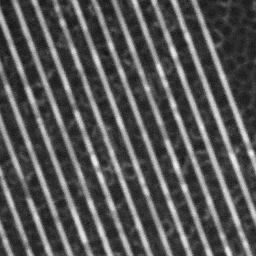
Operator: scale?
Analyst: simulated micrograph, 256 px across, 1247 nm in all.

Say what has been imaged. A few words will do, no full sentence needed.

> parallel lines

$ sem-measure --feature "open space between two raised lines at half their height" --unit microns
0.0734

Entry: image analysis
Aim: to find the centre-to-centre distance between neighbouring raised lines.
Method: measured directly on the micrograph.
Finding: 90.8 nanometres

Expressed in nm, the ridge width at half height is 17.